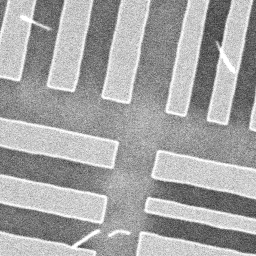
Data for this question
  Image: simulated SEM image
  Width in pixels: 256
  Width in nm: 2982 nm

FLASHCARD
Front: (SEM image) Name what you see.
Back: groups of lines, slits or small figures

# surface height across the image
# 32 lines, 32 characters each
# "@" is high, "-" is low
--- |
-@@@----@@@----@@@@----@@@---@@-
-@@@----@@@----@@@-----@@@---@@-
@@@@----@@@----@@@-----@@@--@@@-
@@@@---@@@@---@@@@-----@@---@@@-
@@@@---@@@@---@@@@-----@@---@@@-
@@@----@@@@---@@@@----@@@---@@--
@@@----@@@----@@@-----@@@---@@--
@@@----@@@----@@@-----@@@--@@@--
@@@---@@@@----@@@-----@@---@@@--
@@@---@@@@---@@@@-----@@---@@@--
------@@@@---@@@@----@@@---@@---
-------------@@@-----@@@---@@---
--------------@@-----@@@--@@@---
---------------------@@---@@@---
--------------------------@@@--@
@@@@---------------------------@
@@@@@@@@@-----------------------
@@@@@@@@@@@@@@------------------
-@@@@@@@@@@@@@@-----------------
------@@@@@@@@------@@@---------
-----------@@@-----@@@@@@@@@----
-------------------@@@@@@@@@@@@@
@@@-----------------@@@@@@@@@@@@
@@@@@@@@------------------@@@@@@
@@@@@@@@@@@@@-----------------@@
-@@@@@@@@@@@@-----@@@@@---------
------@@@@@@@-----@@@@@@@@@-----
----------@@@----------@@@@@@@@@
----------------------------@@@@
@@----------------@@------------
@@@@@@@@---------@@@@@@@@-------
@@@@@@@@@@@@-----@@@@@@@@@@@@@--